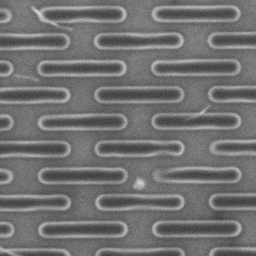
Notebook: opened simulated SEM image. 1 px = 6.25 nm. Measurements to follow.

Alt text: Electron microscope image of groups of lines, slits or small figures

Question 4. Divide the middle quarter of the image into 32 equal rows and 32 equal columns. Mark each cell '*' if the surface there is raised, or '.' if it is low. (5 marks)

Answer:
***************.......**********
***************.......**********
***************........*********
................................
................................
................................
*.......*********************...
*.......**********************..
*.......**********************..
.........*******................
................................
................................
........................********
***************.......**********
***************.......**********
***************.......**********
................................
................................
................................
.........**************....**...
*.......**********************..
*.......**********************..
*.......***************....**...
................................
................................
................................
***************...........******
****************.......*********
****************.......*********
***************.................
................................
................................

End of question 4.